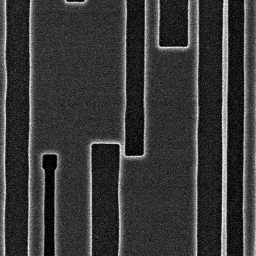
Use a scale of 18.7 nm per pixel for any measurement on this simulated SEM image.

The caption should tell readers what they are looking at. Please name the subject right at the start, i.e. groups of lines, slits or small figures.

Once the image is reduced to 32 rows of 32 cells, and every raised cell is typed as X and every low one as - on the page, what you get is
X---XXXXXXXXXXXX--XX----X------X
X---XXXXXXXXXXXX--XX----X------X
X---XXXXXXXXXXXX--XX----X------X
X---XXXXXXXXXXXX--XX----X------X
X---XXXXXXXXXXXX--XX----X------X
X---XXXXXXXXXXXX--XX---XX------X
X---XXXXXXXXXXXX--XXXXXXX------X
X---XXXXXXXXXXXX--XXXXXXX------X
X---XXXXXXXXXXXX--XXXXXXX------X
X---XXXXXXXXXXXX--XXXXXXX------X
X---XXXXXXXXXXXX--XXXXXXX------X
X---XXXXXXXXXXXX--XXXXXXX------X
X---XXXXXXXXXXXX--XXXXXXX------X
X---XXXXXXXXXXXX--XXXXXXX------X
X---XXXXXXXXXXXX--XXXXXXX------X
X---XXXXXXXXXXXX--XXXXXXX------X
X---XXXXXXXXXXXX--XXXXXXX------X
X---XXXXXXXXXXXX--XXXXXXX-----XX
X---XXXXXXX----X--XXXXXXX-----XX
X---XX-XXXX----X-XXXXXXXX-----XX
X---X--XXXX----XXXXXXXXXX-----XX
X---XX-XXXX----XXXXXXXXXX-----XX
X---XX-XXXX----XXXXXXXXXX-----XX
X---XX-XXXX----XXXXXXXXXX-----XX
X---XX-XXXX----XXXXXXXXXX-----XX
X---X--XXXX----XXXXXXXXXX-----XX
X---X--XXXX----XXXXXXXXXX-----XX
----X--XXXX----XXXXXXXXXX-----XX
----XX-XXXX----XXXXXXXXXX-----XX
X---XX-XXXX----XXXXXXXXXX-----XX
X---X--XXXX----XXXXXXXXXX-----XX
X---X--XXXX----XXXXXXXXXX-----XX